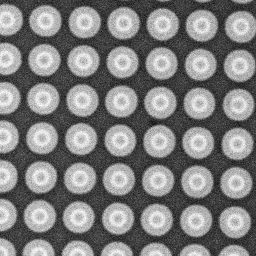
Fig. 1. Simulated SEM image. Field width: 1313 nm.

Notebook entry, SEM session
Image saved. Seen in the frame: an array of small figures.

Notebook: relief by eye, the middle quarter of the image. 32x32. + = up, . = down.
.++++++++..+++++++...+++++++..++
..++++++...+++++++...+++++++..++
...++++.....+++++....++++++....+
.......................+++......
................................
...+++..........................
..+++++.....+++++.....++++......
.+++++++...+++++++...++++++....+
.+++++++..++++++++..++++++++..++
.+++++++..++++++++..++++++++..++
.+++++++...+++++++..++++++++..++
..++++++...+++++++...+++++++..++
...++++.....+++++....++++++....+
.......................++.......
................................
..++++.......+++.......++.......
.++++++....++++++....++++++....+
.+++++++...++++++...+++++++...++
++++++++..++++++++..++++++++..++
++++++++..++++++++..++++++++..++
.+++++++..++++++++..++++++++..++
.++++++....++++++...+++++++...++
...++.......++++.....+++++.....+
................................
................................
..++++......++++......+++.......
.++++++....++++++....+++++.....+
++++++++..+++++++...+++++++...++
++++++++..++++++++..+++++++..+++
++++++++..++++++++..+++++++..+++
+++++++...+++++++...+++++++...++
.++++++....++++++...+++++++...++